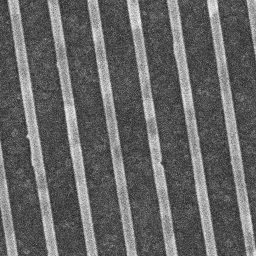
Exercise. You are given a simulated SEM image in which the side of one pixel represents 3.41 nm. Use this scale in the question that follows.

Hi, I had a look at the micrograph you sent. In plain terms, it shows parallel lines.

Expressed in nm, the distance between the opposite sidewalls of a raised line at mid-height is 30.4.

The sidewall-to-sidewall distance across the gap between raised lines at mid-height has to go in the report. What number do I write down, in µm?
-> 0.103